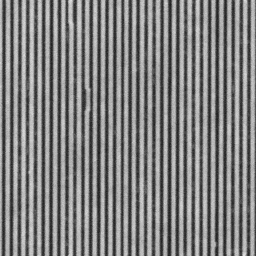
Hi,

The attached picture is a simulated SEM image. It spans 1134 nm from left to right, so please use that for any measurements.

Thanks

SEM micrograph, parallel lines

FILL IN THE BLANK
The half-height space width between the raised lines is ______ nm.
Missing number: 21.6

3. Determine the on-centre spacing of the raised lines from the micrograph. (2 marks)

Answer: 7.9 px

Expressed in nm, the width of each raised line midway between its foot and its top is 12.7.